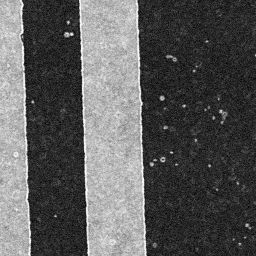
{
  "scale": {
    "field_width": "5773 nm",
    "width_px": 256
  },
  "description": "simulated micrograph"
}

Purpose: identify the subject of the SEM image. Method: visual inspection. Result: one or a few lines or trenches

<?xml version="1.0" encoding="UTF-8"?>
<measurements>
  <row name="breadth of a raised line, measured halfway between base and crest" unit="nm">1290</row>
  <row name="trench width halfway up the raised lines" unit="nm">1310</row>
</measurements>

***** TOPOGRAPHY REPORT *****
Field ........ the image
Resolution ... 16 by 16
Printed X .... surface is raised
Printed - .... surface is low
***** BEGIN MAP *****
X----XXXX-------
X----XXXX-------
X----XXXX-------
X----XXXX-------
X----XXXX-------
XX---XXXX-------
XX---XXXX-------
XX---XXXX-------
XX---XXXX-------
XX---XXXX-------
XX---XXXX-------
XX---XXXX-------
XX---XXXX-------
XX---XXXX-------
XX---XXXX-------
XX----XXX-------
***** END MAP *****